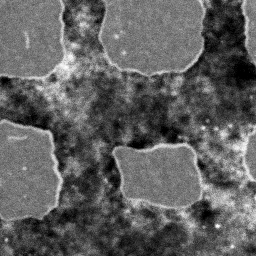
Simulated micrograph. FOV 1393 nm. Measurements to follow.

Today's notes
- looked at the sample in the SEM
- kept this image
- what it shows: raised bodies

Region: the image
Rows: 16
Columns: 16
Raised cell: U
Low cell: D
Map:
UUUUDDDUUUUUUDDU
UUUUDDUUUUUUUDDU
UUUUDDUUUUUUUDDU
UUUUDDDUUUUUDDDD
UUUDDDDDDUUDDDDD
DDDDDDDDDDDDDDDD
DDDDDDDDDDDDDDDD
DDDDDDDDDDDDDDDD
UUUDDDDDDDDDDDDD
UUUDDDDUUUUUDDDU
UUUUDDDUUUUUDDDU
UUUUDDDDUUUUUDDD
UUUUDDDDDUUUDDDD
UUUDDDDDDDDDDDDD
DDDDDDDDDDDDDDDD
DDDDDDDDDDDDDDDD